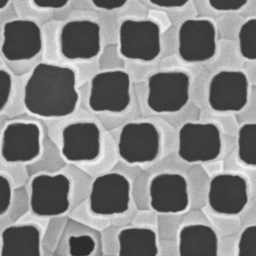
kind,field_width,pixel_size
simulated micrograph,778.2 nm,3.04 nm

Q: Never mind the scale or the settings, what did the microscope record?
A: a regular array of holes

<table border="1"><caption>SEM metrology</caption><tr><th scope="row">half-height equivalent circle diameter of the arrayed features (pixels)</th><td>41.2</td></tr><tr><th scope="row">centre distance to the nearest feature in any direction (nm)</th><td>178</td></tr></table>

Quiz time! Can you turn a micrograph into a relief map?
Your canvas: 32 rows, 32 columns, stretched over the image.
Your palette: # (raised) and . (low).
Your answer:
.####...####...####....###.....#
################################
###############################.
#....###....###.....###....###..
#....###....###.....##.....###..
.....###....###.....##.....###..
.....###....###.....##.....###..
##################.####...######
####....########################
.###.....###....###....####....#
.##......##.....###.....##.....#
.##.......#.....###....###.....#
.##.......#.....###....###.....#
###......##.....###....####...##
#####...########################
##..#####...####...####.#######.
#....###....###.....###....###..
.....###....###.....##......##..
.....###....###.....##......##..
.....###....###.....###....###..
###############################.
################################
.###....####....###....####...##
.###.....###....###....###.....#
.###....###.....###....###.....#
.###.....##.....###....###.....#
####....####...#####.######...##
################################
#...###################...#####.
.....#####.####....####....###..
.....####...###.....##.....###..
.....####..####.....###....###..